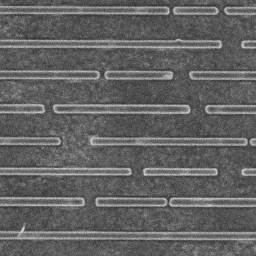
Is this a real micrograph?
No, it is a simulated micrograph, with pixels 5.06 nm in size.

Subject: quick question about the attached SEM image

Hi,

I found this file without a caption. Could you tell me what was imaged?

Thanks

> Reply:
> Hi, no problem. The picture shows parallel lines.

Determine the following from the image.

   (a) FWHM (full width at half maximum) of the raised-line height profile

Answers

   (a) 35.4 nm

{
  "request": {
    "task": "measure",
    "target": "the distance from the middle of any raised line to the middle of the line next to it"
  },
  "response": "0.163 microns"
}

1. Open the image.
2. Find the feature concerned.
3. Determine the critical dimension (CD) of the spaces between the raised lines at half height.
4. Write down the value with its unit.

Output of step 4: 126 nanometers